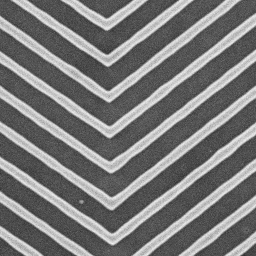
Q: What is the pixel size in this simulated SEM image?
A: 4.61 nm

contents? groups of lines, slits or small figures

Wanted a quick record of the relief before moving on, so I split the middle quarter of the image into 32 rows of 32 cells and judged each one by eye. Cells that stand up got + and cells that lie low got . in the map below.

++..................+++........+
+++................+++........++
.++++............+++.........+++
..++++..........+++........++++.
....++++.......+++........+++...
.....++++....++++.......++++....
......++++..+++........++++.....
........++++++........++++......
+........++++........++++.......
++..................+++........+
++++..............++++........++
.++++............+++.........+++
..++++..........+++.........+++.
....++++......++++........++++..
.....++++....++++........+++....
.......++++.+++.........+++.....
........++++++........++++......
+.........+++........++++.......
+++.................+++........+
++++...............+++........++
..+++............++++........+++
...++++.........++++.......++++.
.....+++.......+++........++++..
......++++...++++........++++...
.......++++.++++........++++....
.........++++++........+++......
+.........+++........++++.......
+++.................++++.......+
.+++...............+++........++
..++++...........++++........+++
...++++.........++++........+++.
.....++++......+++........++++..